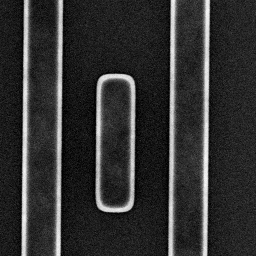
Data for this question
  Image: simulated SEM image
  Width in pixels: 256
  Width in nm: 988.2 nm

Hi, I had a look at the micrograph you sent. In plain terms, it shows groups of lines, slits or small figures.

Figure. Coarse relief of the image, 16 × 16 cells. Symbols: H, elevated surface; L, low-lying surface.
LLHHLLLLLLLHHLLL
LLHHLLLLLLLHHLLL
LLHHLLLLLLLHHLLL
LLHHLLLLLLLHHLLL
LLHHLLLLLLLHHLLL
LLHHLLHHLLLHHLLL
LLHHLLHHLLLHHLLL
LLHHLLHHLLLHHLLL
LLHHLLHHLLLHHLLL
LLHHLLHHLLLHHLLL
LLHHLLHHLLLHHLLL
LLHHLLHHLLLHHLLL
LLHHLLHHLLLHHLLL
LHHHLLLLLLLHHLLL
LHHHLLLLLLLHHLLL
LHHHLLLLLLLHHLLL